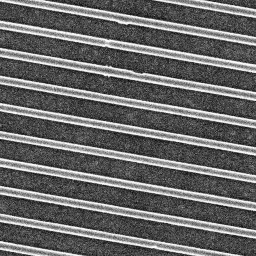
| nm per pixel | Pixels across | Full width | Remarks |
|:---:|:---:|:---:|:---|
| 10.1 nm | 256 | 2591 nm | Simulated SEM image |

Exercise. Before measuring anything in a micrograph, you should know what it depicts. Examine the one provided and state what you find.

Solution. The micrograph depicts parallel lines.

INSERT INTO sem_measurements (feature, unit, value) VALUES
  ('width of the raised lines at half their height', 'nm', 79.7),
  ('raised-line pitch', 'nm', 275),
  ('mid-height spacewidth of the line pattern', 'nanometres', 200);